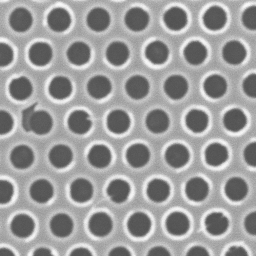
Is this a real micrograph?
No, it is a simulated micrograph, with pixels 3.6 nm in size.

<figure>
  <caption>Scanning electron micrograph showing a regular array of holes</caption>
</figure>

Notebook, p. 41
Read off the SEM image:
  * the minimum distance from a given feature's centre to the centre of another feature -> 139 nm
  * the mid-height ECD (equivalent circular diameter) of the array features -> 0.0855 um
